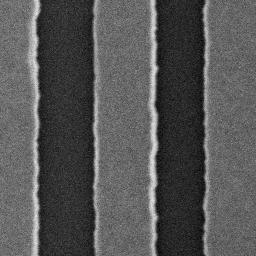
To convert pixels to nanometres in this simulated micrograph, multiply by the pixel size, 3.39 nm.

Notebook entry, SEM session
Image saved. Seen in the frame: lines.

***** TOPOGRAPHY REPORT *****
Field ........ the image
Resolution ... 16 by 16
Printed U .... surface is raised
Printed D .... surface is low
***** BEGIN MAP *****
UUDDDDUUUUDDDUUU
UUDDDDUUUUDDDUUU
UUDDDDUUUUDDDUUU
UUDDDDUUUUDDDUUU
UUDDDDUUUUDDDUUU
UUDDDDUUUUDDDUUU
UUDDDDUUUUDDDUUU
UUDDDDUUUUDDDUUU
UUDDDDUUUUDDDUUU
UUDDDDUUUUDDDUUU
UUDDDDUUUUDDDUUU
UUDDDDUUUUDDDUUU
UUDDDDUUUUDDDUUU
UUDDDDUUUUDDDUUU
UUDDDDUUUUDDDUUU
UUDDDDUUUUDDDUUU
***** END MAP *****